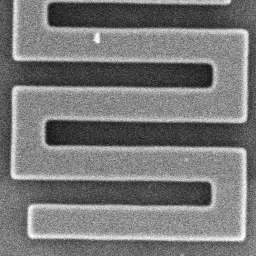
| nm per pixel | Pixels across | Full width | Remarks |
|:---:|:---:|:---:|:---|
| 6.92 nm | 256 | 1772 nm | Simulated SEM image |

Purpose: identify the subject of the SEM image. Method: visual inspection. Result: groups of lines, slits or small figures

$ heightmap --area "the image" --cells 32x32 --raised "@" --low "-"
--@@@@--------------------------
--@@@@--------------------------
--@@@@--------------------------
--@@@@@-------------------------
--@@@@@@@@@@@@@@@@@@@@@@@@@@@@@-
--@@@@@@@@@@@@@@@@@@@@@@@@@@@@@-
--@@@@@@@@@@@@@@@@@@@@@@@@@@@@@-
-----@@@@@@@@@@@@@@@@@@@@@@@@@@-
---------------------------@@@@-
---------------------------@@@@-
---------------------------@@@@-
--@@@@@@@@@@@@@@@@@@@@@@@@@@@@@-
--@@@@@@@@@@@@@@@@@@@@@@@@@@@@@-
--@@@@@@@@@@@@@@@@@@@@@@@@@@@@@-
--@@@@@@@@@@@@@@@@@@@@@@@@@@@@@-
--@@@@--------------------------
--@@@@--------------------------
--@@@@--------------------------
--@@@@@@@@@@@@@@@@@@@@@@@@@@----
-@@@@@@@@@@@@@@@@@@@@@@@@@@@@@@-
-@@@@@@@@@@@@@@@@@@@@@@@@@@@@@@-
-@@@@@@@@@@@@@@@@@@@@@@@@@@@@@@-
-------------@@@---@@@@@@@@@@@@-
---------------------------@@@@-
---------------------------@@@@-
--------------------------@@@@@-
----@@@@@@@@@@@@@@@@@@@@@@@@@@@-
----@@@@@@@@@@@@@@@@@@@@@@@@@@@-
----@@@@@@@@@@@@@@@@@@@@@@@@@@@-
----@@@@@@@@@@@@@@@@@@@@@@@@@@--
--------------------------------
--------------------------------